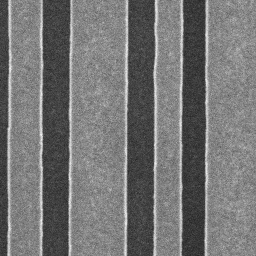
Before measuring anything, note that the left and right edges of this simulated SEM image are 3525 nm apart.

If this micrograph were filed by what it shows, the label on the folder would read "lines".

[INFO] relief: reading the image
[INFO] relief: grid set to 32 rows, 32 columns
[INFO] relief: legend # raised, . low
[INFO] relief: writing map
.####....#######...####...######
.####....#######...####...######
.####....#######...####...######
.####....#######...####...######
.####....#######...####...######
.####....#######....###...######
.####....#######....###...######
.####....#######...####...######
.####....#######...####...######
.####....#######...####...######
.####....#######...####...######
.####....#######...####...######
.####....#######...####...######
.####....#######...####...######
.####....#######...####...######
.####....#######...####...######
.####....#######...####...######
.####....#######...####...######
.####....#######...####...######
.####....#######...####...######
.####....#######...####...######
.####....#######...####...######
.####....#######...####...######
.####....#######...####...######
.####....#######...####...######
.####....#######...####...######
.####....#######...####...######
.####....#######...####...######
.####....#######...####...######
.####....#######...####...######
.####....#######...####...######
.####....#######...####...######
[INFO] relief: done